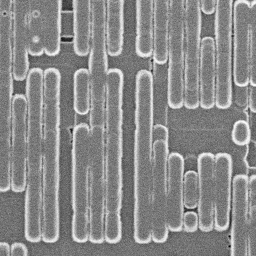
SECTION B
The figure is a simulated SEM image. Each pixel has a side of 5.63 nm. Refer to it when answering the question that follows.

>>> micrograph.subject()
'wiring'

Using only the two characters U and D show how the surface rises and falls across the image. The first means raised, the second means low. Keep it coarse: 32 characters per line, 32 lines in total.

UUUUUUUDDUUUUUUDDUUUUUUUUUUUUUUU
UUUUUUUDDUUUUUUDDUUUUUUUUUUUUUUU
UUUUUUUDDUUUUUUDDUUUUUUUUDDUUUUU
UUUUUUUDDUUUUUUDDUUUUUUUUDDUUUUU
UUUUUUUDDUUUUUUDDUUUUUUUUDDUUUUU
UUUUUUUDDUUUUUUDDUUUUUUUUUUUUUUU
UUUUUUUDDDUUUUUDDUUUUUUUUUUUUUUU
UUUDDDDDDDDUUDDDDDDUUUUUUUUUUUUU
UUUUDDDDDDDUUDDDDDDDDUUUUUUUUUUU
UUUUUUUDDUUUUUUDDUUDDUUUUUUUUUUU
UDDUUUUDDUUUUUUDDUUDDUUUUUUUUDUU
UDDUUUUDDUUUUUUDDUUDDUUUUUUUUDDD
UUUUUUUDDUUUUUUDDUUDDUUUUUUUUDDD
UUUUUUUDDUUUUUUDDUUDDDDDDDDDDDDD
UUUUUUUDDDDUUUUDDUUDDDDDDDDDDDDD
UUUUUUUDDDUUUUUDDUUDDDDDDDDDDUUD
UUUUUUUDDUUUUUUDDUUUUDDDDDDDDUUD
UUUUUUUDDUUUUUUDDUUUUDDDDDDDDUUD
UUUUUUUDDUUUUUUDDUUUUDDDDDDDDDDD
UUUUUUUDDUUUUUUDDUUUUUDDDUUUDDDD
UUUUUUUDDUUUUUUDDUUUUUUDDUUUUDDD
UUUUUUUDDUUUUUUDDUUUUUUDUUUUUDDD
UUUUUUUDDUUUUUUDDUUUUUUUUUUUUUUU
UUUUUUUDDUUUUUUDDUUUUUUUUUUUUUUU
DDDUUUUDDUUUUUUDDUUUUUUUUUUUUUUU
DDDUUUUDDUUUUUUDDUUUUUUUUUUUUUUU
DDDUUUUDDUUUUUUDDUUUUUUDDUUUUUUU
DDDUUUUDDUUUUUUDDUUUUUUUUUUUUUUU
DDDUUUUDDUUUUUUDDUUUUUUUDUDUDUUU
DDDUUUUDDUUUUUUDDUUUUDDDDDDDDUUU
UDDDDDDDDDDDDDDDDDDDDDDDDDDDDUUU
UUUDDDDDDDDDDDDDDDDDDDDDDDDDDUUU